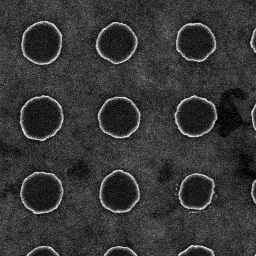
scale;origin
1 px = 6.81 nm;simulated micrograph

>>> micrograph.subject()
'a regular array of raised bodies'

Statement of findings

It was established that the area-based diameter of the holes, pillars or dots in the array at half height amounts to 276 nanometers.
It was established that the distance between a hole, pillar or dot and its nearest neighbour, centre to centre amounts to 507 nm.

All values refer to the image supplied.